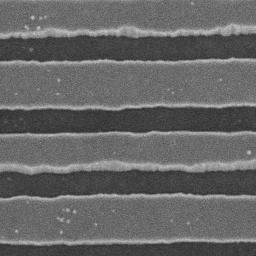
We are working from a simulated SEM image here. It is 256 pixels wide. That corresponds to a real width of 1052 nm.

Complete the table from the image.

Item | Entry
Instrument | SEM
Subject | lines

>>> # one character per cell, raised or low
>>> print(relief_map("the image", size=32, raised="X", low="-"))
XXXXXXXXXXXXXXXXXXXXXXXXXXXXXXXX
XXXXXXXXXXXXXXXXXXXXXXXXXXXXXXXX
XXXXXXXXXXXXXXXXXXXXXXXXXXXXXXXX
XXXXXXXXXXXXXXXXXXXXXXXXXXXXXXXX
XXXX----------------------------
--------------------------------
--------------------------------
------------XX----------XXXXXXXX
XXXXXXXXXXXXXXXXXXXXXXXXXXXXXXXX
XXXXXXXXXXXXXXXXXXXXXXXXXXXXXXXX
XXXXXXXXXXXXXXXXXXXXXXXXXXXXXXXX
XXXXXXXXXXXXXXXXXXXXXXXXXXXXXXXX
XXXXXXXXXXXXXXXXXXXXXXXXXXXXXXXX
XXXXXXXXXXXXXXXXXX--------------
--------------------------------
--------------------------------
-------------------X--XX-------X
XXXXXXXXXXXXXXXXXXXXXXXXXXXXXXXX
XXXXXXXXXXXXXXXXXXXXXXXXXXXXXXXX
XXXXXXXXXXXXXXXXXXXXXXXXXXXXXXXX
XXXXXXXXXXXXXXXXXXXXXXXXXXXXXXXX
--------------------------------
--------------------------------
--------------------------------
--------X--XXXXXXXXXXXXXX-XXX-X-
XXXXXXXXXXXXXXXXXXXXXXXXXXXXXXXX
XXXXXXXXXXXXXXXXXXXXXXXXXXXXXXXX
XXXXXXXXXXXXXXXXXXXXXXXXXXXXXXXX
XXXXXXXXXXXXXXXXXXXXXXXXXXXXXXXX
XXXXXXXXXXXXXXXXXXXXXXXXXXXXXXXX
---XXXX-XX----------------------
--------------------------------